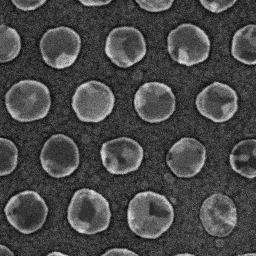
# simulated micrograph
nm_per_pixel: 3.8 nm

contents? a regular array of raised bodies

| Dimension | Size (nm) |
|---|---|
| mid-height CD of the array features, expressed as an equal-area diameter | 150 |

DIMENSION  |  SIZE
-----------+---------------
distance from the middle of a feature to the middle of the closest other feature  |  0.236 micrometres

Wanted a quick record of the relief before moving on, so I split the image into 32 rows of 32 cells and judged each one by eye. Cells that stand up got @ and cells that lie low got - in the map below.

--@@@------@-----@@@@----@@@@---
--------------------------------
--------------------------------
@---------------------@@@------@
@@----@@@@----@@@@---@@@@@---@@@
@@---@@@@@----@@@@---@@@@@---@@@
@@---@@@@@---@@@@@---@@@@@---@@@
@-----@@@-----@@@-----@@@-----@@
--------------------------------
--------------------------------
--@@@------@@-----@@------------
-@@@@@----@@@@---@@@@----@@@@---
-@@@@@---@@@@@---@@@@@---@@@@---
-@@@@@---@@@@@---@@@@@---@@@@---
--@@@-----@@@-----@@@-----@@@---
--------------------------------
--------------------------------
@-----@@@------@-------@-------@
@@---@@@@@---@@@@-----@@@@---@@@
@@---@@@@@---@@@@@---@@@@@---@@@
@@---@@@@@---@@@@----@@@@----@@@
@-----@@@-----@@------@@@-----@@
--------------------------------
--------------------------------
--@@@----@@@-----@@@------------
-@@@@@---@@@@---@@@@@-----------
-@@@@@---@@@@@--@@@@@@----------
-@@@@@---@@@@@--@@@@@@----------
--@@@----@@@@---@@@@@-----------
------------------@@------------
--------------------------------
@-------------@@----------------